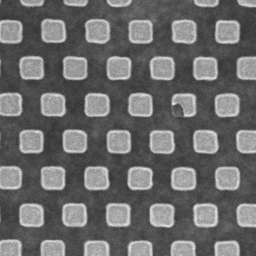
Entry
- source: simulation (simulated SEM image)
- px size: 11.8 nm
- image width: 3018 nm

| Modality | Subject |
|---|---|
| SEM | a regular array of raised bodies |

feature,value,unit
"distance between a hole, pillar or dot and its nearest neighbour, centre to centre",500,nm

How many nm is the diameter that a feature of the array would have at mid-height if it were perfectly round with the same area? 295